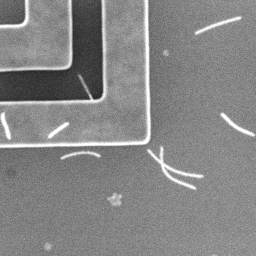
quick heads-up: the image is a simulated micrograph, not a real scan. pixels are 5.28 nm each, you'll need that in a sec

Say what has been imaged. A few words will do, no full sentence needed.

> groups of lines, slits or small figures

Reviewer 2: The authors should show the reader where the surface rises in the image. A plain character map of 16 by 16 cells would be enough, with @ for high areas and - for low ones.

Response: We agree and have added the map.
--@@--@@@-------
-@@@--@@@-------
@@@@--@@@-------
@@@@--@@@-------
------@@@-------
------@@@-------
@@@@@@@@@-------
@@@@@@@@@-------
@@@@@@@@@-------
----------------
----------------
----------------
----------------
----------------
----------------
----------------